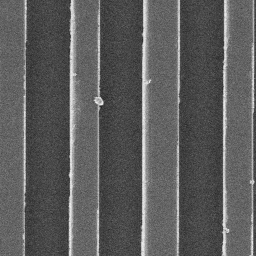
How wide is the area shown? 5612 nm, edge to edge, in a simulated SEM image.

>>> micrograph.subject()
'lines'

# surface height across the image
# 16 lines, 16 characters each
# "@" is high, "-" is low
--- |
@@--@@---@@---@@
@@--@@---@@---@@
@@--@@---@@---@@
@@--@@---@@---@@
@@--@@---@@---@@
@@--@@---@@---@@
@@--@@---@@---@@
@@--@@---@@---@@
@@--@@---@@---@@
@@--@@---@@---@@
@---@@---@@---@@
@---@@---@@---@@
@---@@---@@---@@
@---@@---@@---@@
@---@@---@@---@@
@---@@---@@---@@